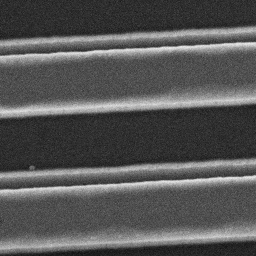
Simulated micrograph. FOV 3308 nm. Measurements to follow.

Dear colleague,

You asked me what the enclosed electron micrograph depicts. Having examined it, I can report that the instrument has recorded lines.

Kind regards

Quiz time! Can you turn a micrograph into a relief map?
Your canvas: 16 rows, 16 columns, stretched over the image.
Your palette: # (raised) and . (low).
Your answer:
................
................
......##########
################
################
################
###########.....
................
................
................
..........######
################
################
################
################
##..............